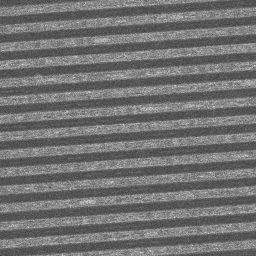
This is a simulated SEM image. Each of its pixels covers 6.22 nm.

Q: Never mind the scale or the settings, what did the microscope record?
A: parallel lines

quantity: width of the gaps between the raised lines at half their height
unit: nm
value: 53.5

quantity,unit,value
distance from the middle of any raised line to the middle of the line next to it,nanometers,111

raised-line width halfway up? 9.6 px